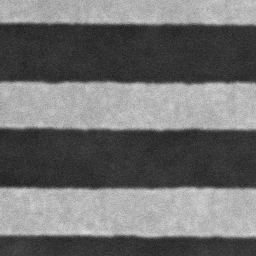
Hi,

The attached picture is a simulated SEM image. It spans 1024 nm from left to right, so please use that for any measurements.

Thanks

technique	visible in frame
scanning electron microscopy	lines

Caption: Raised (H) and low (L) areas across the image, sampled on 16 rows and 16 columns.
HHHHHHHHHHHHHHHH
LLLLLLLLLLLLLLLL
LLLLLLLLLLLLLLLL
LLLLLLLLLLLLLLLL
LLLLLLLLLLLLLLLL
HHHHHHHHHHHHHHHH
HHHHHHHHHHHHHHHH
HHHHHHHHHHHHHHHH
LLLLLLLLLLLLLLLL
LLLLLLLLLLLLLLLL
LLLLLLLLLLLLLLLL
LLLLLLLLLLLLLLLL
HHHHHHHHHHHHHHHH
HHHHHHHHHHHHHHHH
HHHHHHHHHHHHHHHH
LLLLLLLLLLLLLLLL